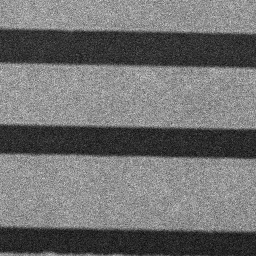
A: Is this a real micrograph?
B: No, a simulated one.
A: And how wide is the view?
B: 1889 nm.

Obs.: one or a few lines or trenches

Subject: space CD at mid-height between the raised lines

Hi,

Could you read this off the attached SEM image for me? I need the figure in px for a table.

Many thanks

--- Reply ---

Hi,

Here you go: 31.4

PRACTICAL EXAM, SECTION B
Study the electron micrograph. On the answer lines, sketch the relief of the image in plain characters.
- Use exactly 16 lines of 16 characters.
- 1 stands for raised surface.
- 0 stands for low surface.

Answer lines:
1111111111111111
1111111111111111
0000000000000000
0000000000000000
1111111111111111
1111111111111111
1111111111111111
1111111111111111
0000000000000000
0000000000000000
1111111111111111
1111111111111111
1111111111111111
1111111111111111
0000000000000000
0000000000000000